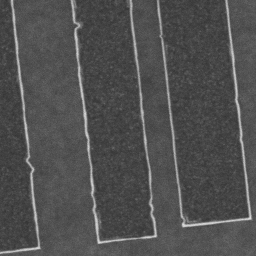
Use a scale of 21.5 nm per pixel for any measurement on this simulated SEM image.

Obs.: one or a few lines or trenches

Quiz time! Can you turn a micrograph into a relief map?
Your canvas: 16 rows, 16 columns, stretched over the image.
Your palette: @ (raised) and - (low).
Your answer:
@----@@@--@@@@--
@----@@@--@@@@--
@----@@@--@@@@--
@----@@@@-@@@@@-
@----@@@@-@@@@@-
@----@@@@-@@@@@-
@----@@@@--@@@@-
@@---@@@@--@@@@-
@@---@@@@--@@@@-
@@----@@@--@@@@-
@@----@@@--@@@@-
@@----@@@--@@@@-
@@----@@@--@@@@@
@@----@@@@-@@@@-
@@----@@@@------
@@--------------